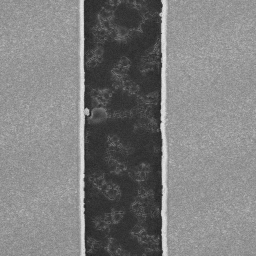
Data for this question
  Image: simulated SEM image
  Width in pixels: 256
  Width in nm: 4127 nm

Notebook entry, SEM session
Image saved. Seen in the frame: one or a few lines or trenches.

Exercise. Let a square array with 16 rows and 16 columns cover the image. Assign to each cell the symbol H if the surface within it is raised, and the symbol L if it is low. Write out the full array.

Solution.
HHHHHLLLLLHHHHHH
HHHHHLLLLLHHHHHH
HHHHHLLLLLHHHHHH
HHHHHLLLLLHHHHHH
HHHHHLLLLLHHHHHH
HHHHHLLLLLHHHHHH
HHHHHLLLLLHHHHHH
HHHHHLLLLLHHHHHH
HHHHHLLLLLHHHHHH
HHHHHLLLLLHHHHHH
HHHHHLLLLLHHHHHH
HHHHHLLLLLHHHHHH
HHHHHLLLLLHHHHHH
HHHHHLLLLLHHHHHH
HHHHHLLLLLHHHHHH
HHHHHLLLLLHHHHHH